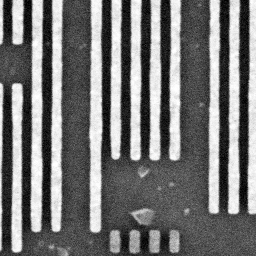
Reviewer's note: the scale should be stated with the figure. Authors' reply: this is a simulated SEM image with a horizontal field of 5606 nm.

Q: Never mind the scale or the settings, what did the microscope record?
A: wiring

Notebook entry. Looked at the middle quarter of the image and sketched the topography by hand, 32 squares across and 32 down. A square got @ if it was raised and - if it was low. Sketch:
-------@@---@@---@@---@@---@@---
-------@@---@@---@@---@@---@@---
-------@@---@@---@@---@@---@@---
-------@@---@@---@@---@@---@@---
-------@@---@@---@@---@@---@@---
-------@@---@@---@@---@@---@@---
-------@@---@@---@@---@@---@@---
-------@@---@@---@@---@@---@@---
-------@@---@@---@@---@@---@@---
-------@@---@@---@@---@@---@@---
-------@@---@@---@@---@@---@@---
-------@@---@@---@@---@@---@@---
-------@@---@@---@@---@@---@@---
-------@@---@@---@@---@@---@@---
-------@@---@@---@@---@@---@@---
-------@@---@@---@@---@@---@@---
-------@@---@@---@@---@@---@@---
-------@@---@@---@@---@@---@@---
-------@@---@@---@@---@@---@@---
-------@@---@@---@@---@@---@@---
-------@@---@@---@@---@@---@@---
-------@@---@@---@@---@@---@@---
-------@@---@@---@@---@@---@@---
-------@@---@----@@---@@---@----
-------@@-----------------------
-------@@-----------------------
-------@@-----------------------
-------@@----------@------------
-------@@-----------------------
-------@@-----------------------
-------@@-----------------------
-------@@-----------------------